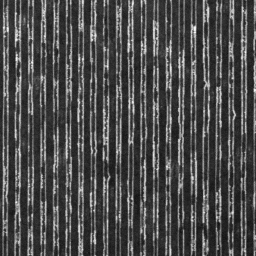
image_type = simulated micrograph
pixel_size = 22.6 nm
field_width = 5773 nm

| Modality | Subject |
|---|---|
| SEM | parallel lines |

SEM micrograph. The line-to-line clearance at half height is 183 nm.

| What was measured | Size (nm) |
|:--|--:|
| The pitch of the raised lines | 283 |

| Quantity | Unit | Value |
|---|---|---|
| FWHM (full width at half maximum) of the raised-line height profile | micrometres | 0.102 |